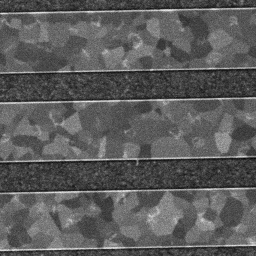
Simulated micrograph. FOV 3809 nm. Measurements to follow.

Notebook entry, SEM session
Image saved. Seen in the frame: one or a few lines or trenches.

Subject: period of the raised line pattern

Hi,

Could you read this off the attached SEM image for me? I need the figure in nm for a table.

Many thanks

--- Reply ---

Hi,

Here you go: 1330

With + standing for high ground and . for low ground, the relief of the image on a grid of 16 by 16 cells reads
................
++++++++++++++++
++++++++++++++++
++++++++++++++++
+...............
................
++++++++++++++++
++++++++++++++++
++++++++++++++++
++++++++++++++++
................
................
++++++++++++++++
++++++++++++++++
++++++++++++++++
++++++..........